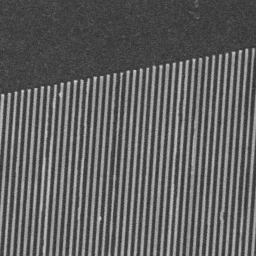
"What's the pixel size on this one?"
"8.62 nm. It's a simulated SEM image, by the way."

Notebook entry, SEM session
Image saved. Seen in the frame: parallel lines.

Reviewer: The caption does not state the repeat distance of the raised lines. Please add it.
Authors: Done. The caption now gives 56 nm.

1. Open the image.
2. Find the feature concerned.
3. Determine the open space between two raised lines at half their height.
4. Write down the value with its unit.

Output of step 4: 33.3 nanometers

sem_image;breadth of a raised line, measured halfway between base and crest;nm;17.2